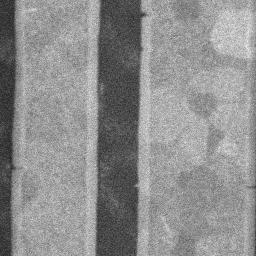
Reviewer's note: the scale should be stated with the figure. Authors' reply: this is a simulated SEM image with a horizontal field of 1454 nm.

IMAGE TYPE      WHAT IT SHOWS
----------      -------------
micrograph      one or a few lines or trenches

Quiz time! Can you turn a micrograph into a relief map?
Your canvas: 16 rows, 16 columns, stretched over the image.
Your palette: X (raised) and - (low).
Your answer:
-XXXXX---XXXXXXX
-XXXXX---XXXXXXX
-XXXXX---XXXXXXX
-XXXXX---XXXXXXX
-XXXXX---XXXXXXX
-XXXXX---XXXXXXX
-XXXXX---XXXXXXX
-XXXXX---XXXXXXX
-XXXXX---XXXXXXX
-XXXXX---XXXXXXX
-XXXXX---XXXXXXX
-XXXXX---XXXXXXX
-XXXXX---XXXXXXX
-XXXXX---XXXXXXX
-XXXXX---XXXXXXX
-XXXXX---XXXXXXX